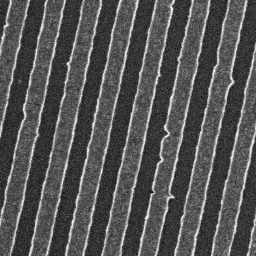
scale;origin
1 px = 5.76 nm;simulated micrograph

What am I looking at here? parallel lines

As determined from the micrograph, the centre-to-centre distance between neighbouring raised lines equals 205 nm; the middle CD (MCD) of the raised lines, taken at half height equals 103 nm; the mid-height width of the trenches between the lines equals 0.102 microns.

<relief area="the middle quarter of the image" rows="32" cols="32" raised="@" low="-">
-@@@@@----@@@@@-----@@@@-----@@@
-@@@@@----@@@@@----@@@@@----@@@@
-@@@@-----@@@@-----@@@@@----@@@@
-@@@@-----@@@@-----@@@@-----@@@@
@@@@@-----@@@@-----@@@@-----@@@@
@@@@@----@@@@@----@@@@@-----@@@@
@@@@@----@@@@@----@@@@@----@@@@@
@@@@-----@@@@@----@@@@@----@@@@@
@@@@-----@@@@-----@@@@-----@@@@@
@@@@----@@@@@-----@@@@-----@@@@-
@@@@----@@@@@----@@@@@-----@@@@-
@@@-----@@@@@----@@@@@----@@@@@-
@@@-----@@@@-----@@@@-----@@@@@-
@@@-----@@@@-----@@@@-----@@@@--
@@@----@@@@@-----@@@@-----@@@@--
@@@----@@@@@----@@@@@----@@@@@--
@@-----@@@@@----@@@@@----@@@@@--
@@-----@@@@-----@@@@------@@@@--
@@-----@@@@-----@@@@-----@@@@---
@@----@@@@@-----@@@@-----@@@@---
@@----@@@@@----@@@@@----@@@@@---
@-----@@@@@----@@@@@----@@@@@---
@-----@@@@-----@@@@-----@@@@----
@-----@@@@-----@@@@-----@@@@----
@----@@@@@----@@@@@-----@@@@----
@----@@@@@----@@@@@----@@@@@----
-----@@@@@----@@@@@----@@@@@----
-----@@@@-----@@@@-----@@@@-----
-----@@@@----@@@@@-----@@@@-----
----@@@@@----@@@@@-----@@@@-----
----@@@@@----@@@@@----@@@@@----@
----@@@@-----@@@@-----@@@@-----@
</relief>